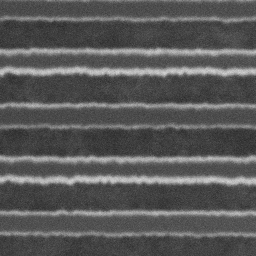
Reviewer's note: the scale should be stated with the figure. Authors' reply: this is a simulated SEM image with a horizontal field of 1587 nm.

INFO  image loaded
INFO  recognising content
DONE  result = lines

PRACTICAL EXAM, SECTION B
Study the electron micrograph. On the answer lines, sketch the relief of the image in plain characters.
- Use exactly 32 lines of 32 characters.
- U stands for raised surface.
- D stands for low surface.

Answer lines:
UUUUUUUUUUUUUUUUUUUUUUUUUUUUUUUU
UUUUUUUUUUUUUUUUUUUUUUUUUUUUUUUU
DDDDDDDDDUUDDDDDUUUUDUDDDDDUUUDD
DDDDDDDDDDDDDDDDDDDDDDDDDDDDDDDD
DDDDDDDDDDDDDDDDDDDDDDDDDDDDDDDD
DDDDDDDDDDDDDDDDDDDDDDDDDDDDDDDD
UUUUUUUUUUUUUUUUUUUUUUUUUUUUUUUU
UUUUUUUUUUUUUUUUUUUUUUUUUUUUUUUU
UUUUUUUUUUUUUUUUUUUUUUUUUUUUUUUU
DDDDDDDDDDDDDDDDDDDDDDDDDDDDDDDD
DDDDDDDDDDDDDDDDDDDDDDDDDDDDDDDD
DDDDDDDDDDDDDDDDDDDDDDDDDDDDDDDD
DDDDDDDDDDDDDDDDDDDDDDDDDDDDDDDD
UUUUUUUUUUUUUUUUUUUUUUUUUUUUUUUU
UUUUUUUUUUUUUUUUUUUUUUUUUUUUUUUU
UUUUUUUUUUUUUUUUUUUUUUUUUUUUUUUU
DDDDDDDDDDDDDDDDDDDDDDDDDDDDDDDD
DDDDDDDDDDDDDDDDDDDDDDDDDDDDDDDD
DDDDDDDDDDDDDDDDDDDDDDDDDDDDDDDD
DDDDDDDDDDDDDDDDDDDDDDDDDDDDDDDD
UUUUUUUUUUUUUUUUUUUUUUUUUUUUUUUU
UUUUUUUUUUUUUUUUUUUUUUUUUUUUUUUU
UDUUUUUUUUUUUUUUUUUUUUUUUUUUUUUU
DDDDDDDDDDDDDDDDDDDDDDDDDDDDDDDD
DDDDDDDDDDDDDDDDDDDDDDDDDDDDDDDD
DDDDDDDDDDDDDDDDDDDDDDDDDDDDDDDD
UUUDDDDUUUUUUUUUUUUUUUUUUUUUUUDU
UUUUUUUUUUUUUUUUUUUUUUUUUUUUUUUU
UUUUUUUUUUUUUUUUUUUUUUUUUUUUUUUU
DDDDDDDDDDDDDDDDDDDDDDDDDDDDDDDD
DDDDDDDDDDDDDDDDDDDDDDDDDDDDDDDD
DDDDDDDDDDDDDDDDDDDDDDDDDDDDDDDD